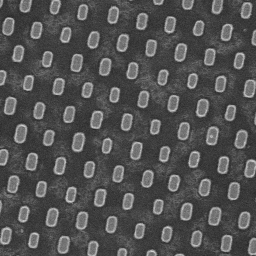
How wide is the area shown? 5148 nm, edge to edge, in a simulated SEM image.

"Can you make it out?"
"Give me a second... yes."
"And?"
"a regular array of raised bodies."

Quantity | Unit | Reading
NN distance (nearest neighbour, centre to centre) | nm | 573